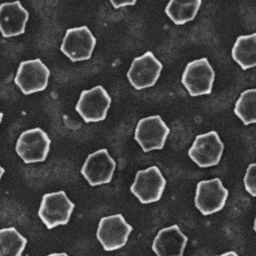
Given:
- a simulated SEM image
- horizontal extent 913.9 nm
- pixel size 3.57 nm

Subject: a regular array of raised bodies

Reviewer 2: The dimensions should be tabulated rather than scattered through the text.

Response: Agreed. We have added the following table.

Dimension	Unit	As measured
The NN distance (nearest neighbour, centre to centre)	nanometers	195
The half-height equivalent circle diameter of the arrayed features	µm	0.117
